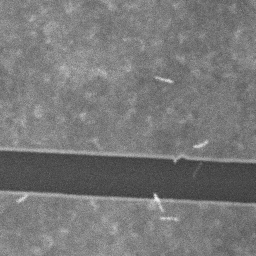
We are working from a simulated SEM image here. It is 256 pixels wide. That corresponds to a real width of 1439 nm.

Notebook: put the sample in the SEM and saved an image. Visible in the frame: one or a few lines or trenches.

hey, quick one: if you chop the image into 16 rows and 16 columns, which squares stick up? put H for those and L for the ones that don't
HHHHHHHHHHHHHHHH
HHHHHHHHHHHHHHHH
HHHHHHHHHHHHHHHH
HHHHHHHHHHHHHHHH
HHHHHHHHHHHHHHHH
HHHHHHHHHHHHHHHH
HHHHHHHHHHHHHHHH
HHHHHHHHHHHHHHHH
HHHHHHHHHHHHHHHH
LLLLHHHHHHHHHHHH
LLLLLLLLLLLLLLLL
LLLLLLLLLLLLLLLL
HHHHHHHHHHLLLLLL
HHHHHHHHHHHHHHHH
HHHHHHHHHHHHHHHH
HHHHHHHHHHHHHHHH